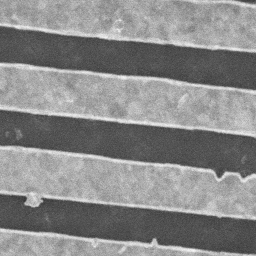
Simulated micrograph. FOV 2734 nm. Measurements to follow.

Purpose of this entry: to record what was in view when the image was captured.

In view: one or a few lines or trenches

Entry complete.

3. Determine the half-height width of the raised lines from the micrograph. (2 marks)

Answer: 465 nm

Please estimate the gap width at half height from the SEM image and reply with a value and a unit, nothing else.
413 nm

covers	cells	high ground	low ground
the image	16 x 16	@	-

@@@@@@@@@@@@@@@@
@@@@@@@@@@@@@@@@
---------@@@@@@@
----------------
@@@@@-----------
@@@@@@@@@@@@@@--
@@@@@@@@@@@@@@@@
-------@@@@@@@@@
----------------
@@@-------------
@@@@@@@@@@@@----
@@@@@@@@@@@@@@@@
--@--@@@@@@@@@@@
---------------@
@---------------
@@@@@@@@@@------